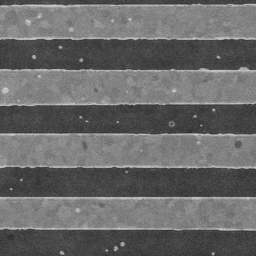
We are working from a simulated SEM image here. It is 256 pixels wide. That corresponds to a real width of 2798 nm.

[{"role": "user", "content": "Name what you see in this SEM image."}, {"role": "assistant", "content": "lines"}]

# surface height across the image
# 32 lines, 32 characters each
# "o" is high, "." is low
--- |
................................
oooooooooooooooooooooooooooooooo
oooooooooooooooooooooooooooooooo
oooooooooooooooooooooooooooooooo
oooooooooooooooooooooooooooooooo
................................
................................
................................
................................
oooooooooooooooooooooooooooooooo
oooooooooooooooooooooooooooooooo
oooooooooooooooooooooooooooooooo
oooooooooooooooooooooooooooooooo
................................
................................
................................
................................
oooooooooooooooooooooooooooooooo
oooooooooooooooooooooooooooooooo
oooooooooooooooooooooooooooooooo
oooooooooooooooooooooooooooooooo
................................
................................
................................
................................
oooooooooooooooooooooooooooooooo
oooooooooooooooooooooooooooooooo
oooooooooooooooooooooooooooooooo
oooooooooooooooooooooooooooooooo
................................
................................
................................